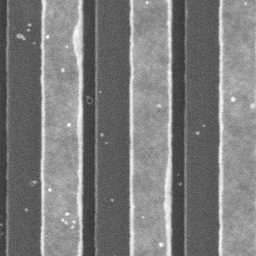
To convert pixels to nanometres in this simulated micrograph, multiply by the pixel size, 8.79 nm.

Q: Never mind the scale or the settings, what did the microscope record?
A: lines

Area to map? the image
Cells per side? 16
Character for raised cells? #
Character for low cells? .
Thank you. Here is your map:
...##...###...##
...##...###...##
...##...###...##
...##...###...##
...##...###...##
...##...###...##
...##...###...##
...##...###...##
...##...###...##
...##...###...##
...##...###...##
...##...###...##
...##...###...##
...##...###...##
...##...###...##
...##...###...##